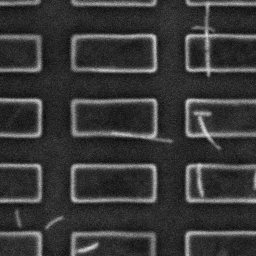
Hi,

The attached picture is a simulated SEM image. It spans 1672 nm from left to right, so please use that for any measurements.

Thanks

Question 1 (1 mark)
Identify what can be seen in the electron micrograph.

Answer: wiring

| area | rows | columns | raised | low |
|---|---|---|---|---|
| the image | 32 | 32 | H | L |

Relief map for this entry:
HHLLLLLLLLHHHHHHHHHLLLLLHHHHHHHH
LLLLLLLLLLLLLLLLLLLLLLLLLLLLLLLL
LLLLLLLLLLLLLLLLLLLLLLLLLLLLLLLL
LLLLLLLLLLLLLLLLLLLLLLLLLLLLLLLL
LLLLLLLLLLHHHHHLHHHLLLLLHHHHHHLL
HHHHHLLLLHHHHHHHHHHLLLLHHHHHHHHH
HHHHHLLLLHHHHHHHHHHLLLLHHHHHHHHH
HHHHHLLLLHHHHHHHHHHLLLLHHHHHHHHH
HHHHHLLLLHHHHHHHHHHLLLLLHHHHHHHH
LLLLLLLLLLLLLLLLLLLLLLLLLLLLLLLL
LLLLLLLLLLLLLLLLLLLLLLLLLLLLLLLL
LLLLLLLLLLLLLLLLLLLLLLLLLLLLLLLL
HLLLLLLLLLLLLLLLLLLLLLLLLLLLLLLL
HHHHHLLLLHHHHHHHHHHLLLLHHHHHHHHH
HHHHHLLLLHHHHHHHHHHLLLLHHHHHHHHH
HHHHHLLLLHHHHHHHHHHLLLLHHHHHHHHH
HHHHHLLLLHHHHHHHHHHLLLLHHHHHHHHH
LLLLLLLLLLLLLLLLLLLLLLLLLLLLLLLL
LLLLLLLLLLLLLLLLLLLLLLLLLLLLLLLL
LLLLLLLLLLLLLLLLLLLLLLLLLLLLLLLL
LLLLLLLLLLLLLLLLLLLLLLLLLLLLLLLL
HHHHHLLLLHHHHHHHHHHLLLLHHHHHHHHH
HHHHHLLLLHHHHHHHHHHLLLLHHHHHHHHH
HHHHHLLLLHHHHHHHHHHLLLLHHHHHHHHH
HHHHHLLLLHHHHHHHHHHLLLLHHHHHHHHH
LLLLLLLLLLLLLLLLLLLLLLLLLLLLLLLL
LLLLLLLLLLLLLLLLLLLLLLLLLLLLLLLL
LLLLLLLLLLLLLLLLLLLLLLLLLLLLLLLL
LLLLLLLLLLLLLLLLLLLLLLLLLLLLLLLL
HHHHHLLLLHHHHHHHHHHLLLLHHHHHHHHH
HHHHHLLLLHHHHHHHHHHLLLLHHHHHHHHH
HHHHHLLLLHHHHHHHHHHLLLLHHHHHHHHH